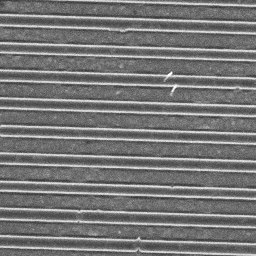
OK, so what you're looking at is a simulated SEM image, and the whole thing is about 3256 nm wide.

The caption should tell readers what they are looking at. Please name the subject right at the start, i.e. parallel lines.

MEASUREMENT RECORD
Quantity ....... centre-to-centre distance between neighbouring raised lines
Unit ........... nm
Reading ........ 352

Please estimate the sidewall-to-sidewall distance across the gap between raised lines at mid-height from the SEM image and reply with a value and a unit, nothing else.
214 nanometers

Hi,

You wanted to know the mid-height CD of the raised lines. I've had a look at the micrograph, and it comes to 143 nanometres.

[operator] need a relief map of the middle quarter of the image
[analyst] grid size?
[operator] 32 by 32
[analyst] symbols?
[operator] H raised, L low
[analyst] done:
LLLLLLLLLLLLLLLLLLLLLLLLLLLLLLLL
LLLLLLLLLLLLLLLLLLLLLLLLLLLLLLLL
HHHHHHHHHHHHHHLLLLLLLLLLLLHLLLLL
HHHHHHHHHHHHHHHHHHHHHHHHHHHHHHHH
HHHHHHHHHHHHHHHHHHHHHHHHHHHHHHHH
LLLLLLLLLLLLLLLLLLLLLLLLLLHHHHHH
LLLLLLLLLLLLLLLLLLLLLLLLLLLLLLLL
LLLLLLLLLLLLLLLLLLLLLLLLLLLLLLLL
LLLLLLLLLLLLLLLLLLLLLLLLLLLLLLLL
HHHHHHHHHHHHLLLLLLLLLLLLLLLLLLLL
HHHHHHHHHHHHHHHHHHHHHHHHHHHHHHHH
HHHHHHHHHHHHHHHHHHHHHHHHHHHHHHHH
LLLLLLLLLLLLLLLLLLLLLLLLLLLLLLLH
LLLLLLLLLLLLLLLLLLLLLLLLLLLLLLLL
LLLLLLLLLLLLLLLLLLLLLLLLLLLLLLLL
LLLLLLLLLLLLLLLLLLLLLLLLLLLLLLLL
HHHHHHHHHHHHHHHHHLLLLLLLLLLLLLLL
HHHHHHHHHHHHHHHHHHHHHHHHHHHHHHHH
LLLLLLHHHHHHHHHHHHHHHHHHHHHHHHHH
LLLLLLLLLLLLLLLLLLLLLLLLLLLLLLLL
LLLLLLLLLLLLLLLLLLLLLLLLLLLLLLLL
LLLLLLLLLLLLLLLLLLLLLLLLLLLLLLLL
LLLLLLLLLLLLLLLLLLLLLLLLLLLLLLLL
HHHHHHHHHHHHHHHHHHHHHHLLLLLLLLLL
HHHHHHHHHHHHHHHHHHHHHHHHHHHHHHHH
LLLLHHHHHHHHHHHHHHHHHHHHHHHHHHHH
LLLLLLLLLLLLLLLLLLLLLLLLLLLLLLLL
LLLLLLLLLLLLLLLLLLLLLLLLLLLLLLLL
LLLLLLLLLLLLLLLLLLLLLLLLLLLLLLLL
LLLLLLLLLLLLLLLLLLLLLLLLLLLLLLLL
HHHHHHHHHHHHHHHHHHHHLLLLLLLLLLLL
HHHHHHHHHHHHHHHHHHHHHHHHHHHHHHHH